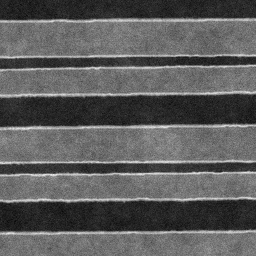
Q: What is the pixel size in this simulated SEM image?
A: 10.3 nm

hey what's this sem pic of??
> lines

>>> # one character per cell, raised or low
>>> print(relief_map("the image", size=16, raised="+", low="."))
................
++++++++++++++++
++++++++++++++++
++++++++++++++++
++++++++++++++++
++++++++++++++++
................
................
++++++++++++++++
++++++++++++++++
++++++++++++++++
++++++++++++++++
++..+...........
................
...............+
++++++++++++++++